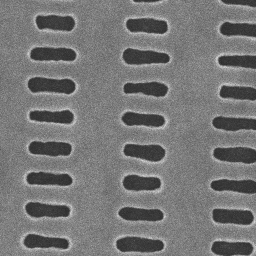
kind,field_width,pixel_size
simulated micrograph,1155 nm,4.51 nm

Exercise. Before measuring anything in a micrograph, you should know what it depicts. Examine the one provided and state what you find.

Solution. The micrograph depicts a regular array of holes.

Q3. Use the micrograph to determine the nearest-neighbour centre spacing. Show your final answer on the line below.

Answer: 141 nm